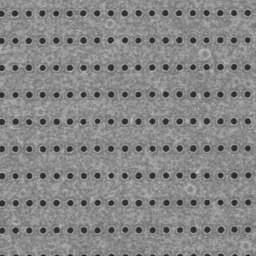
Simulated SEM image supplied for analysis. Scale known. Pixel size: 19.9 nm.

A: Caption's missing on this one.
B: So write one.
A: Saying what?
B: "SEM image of a regular array of holes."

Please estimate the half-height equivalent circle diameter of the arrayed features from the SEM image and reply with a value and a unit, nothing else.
129 nanometers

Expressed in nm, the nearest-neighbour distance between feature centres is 269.